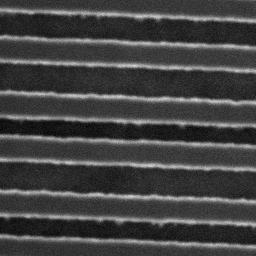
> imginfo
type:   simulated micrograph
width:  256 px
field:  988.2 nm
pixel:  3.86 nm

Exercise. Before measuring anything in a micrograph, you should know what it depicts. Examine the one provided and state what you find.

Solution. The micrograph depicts lines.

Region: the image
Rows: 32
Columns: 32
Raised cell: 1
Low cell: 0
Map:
11111111111111111111111111111111
00111111111111111111111111111111
00000000000000000000000001111111
00000000000000000000000000000000
10000000000000000000000000000000
11111111111111111111111000000000
11111111111111111111111111111111
11111111111111111111111111111111
00000000000000000000111111111111
00000000000000000000000000000000
00000000000000000000000000000000
11100000000000000000000000000000
11111111111111111111111111000000
11111111111111111111111111111111
11111111111111111111111111111111
00000000000000000000000011111111
00000000000000000000000000000000
11111111111111000000000000000000
11111111111111111111111111111111
11111111111111111111111111111111
00000000001111111111111111111111
00000000000000000000000000000000
00000000000000000000000000000000
00000000000000000000000000000000
11111111111111111101000000000000
11111111111111111111111111111111
11111111111111111111111111111111
00000000000000011111111111111111
00000000000000000000000000000000
11000000000000000000000000000000
11111111111111111111111110000000
11111111111111111111111111111111